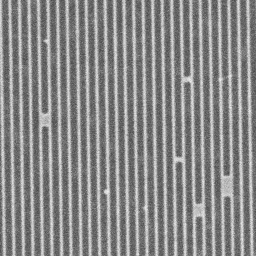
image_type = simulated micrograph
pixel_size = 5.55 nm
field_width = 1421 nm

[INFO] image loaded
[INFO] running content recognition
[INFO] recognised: parallel lines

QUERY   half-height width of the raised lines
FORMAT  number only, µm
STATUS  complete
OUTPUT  0.0083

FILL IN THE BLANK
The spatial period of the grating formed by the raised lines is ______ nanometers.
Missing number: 52.9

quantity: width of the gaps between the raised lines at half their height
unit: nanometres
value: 43.7